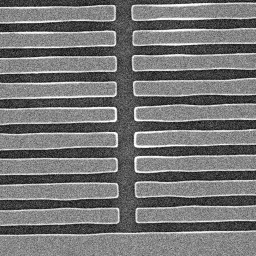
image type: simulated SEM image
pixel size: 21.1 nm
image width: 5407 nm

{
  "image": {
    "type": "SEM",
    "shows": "groups of lines, slits or small figures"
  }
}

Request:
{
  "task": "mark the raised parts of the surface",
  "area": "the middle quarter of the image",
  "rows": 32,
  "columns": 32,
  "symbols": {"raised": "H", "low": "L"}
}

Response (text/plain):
HHHHHHHHHHHHHLLLLHHHHHHHHHHHHHHH
HHHHHHHHHHHHHLLLLLHHHHHHHHHHHHLL
LLLLLLLLLLLLLLLLLLLLLLLLLLLLLLLL
LLLLLLLLLLLLLLLLLLLLLLLLLLLLLLLL
LLLLLLLLLLLLLLLLLLHHHHHHHHHHHHHH
HHHHHHHHHHHHHLLLLLHHHHHHHHHHHHHH
HHHHHHHHHHHHHLLLLLHHHHHHHHHHHHHH
HHHHHHHHHHHHHLLLLLHHHHHHHHHHHHHH
LLLLLLLLLLLLLLLLLLLLLLLLLLLLLLLL
LLLLLLLLLLLLLLLLLLLLLLLLLLLLLLLL
LLLLLLLLLLLLLLLLLLLLLLLLLHHHHHHH
HHHHHHHHHHHHHLLLLLHHHHHHHHHHHHHH
HHHHHHHHHHHHHLLLLLHHHHHHHHHHHHHH
HHHHHHHHHHHHHLLLLLHHHHHHHHHHHHHH
HHHLLLLLLLLLLLLLLLLLLLLLLLLLLLLL
LLLLLLLLLLLLLLLLLLLLLLLLLLLLLLLL
LLLLLLLLLLLLLLLLLLLLLLLLLLLLLLLL
HHHHHHHHHHHHHLLLLLHHHHHHHHHHHHHH
HHHHHHHHHHHHHLLLLLHHHHHHHHHHHHHH
HHHHHHHHHHHHHLLLLLHHHHHHHHHHHHHH
HHHHHHHHHHHHHLLLLLHHHHHHHLLLLLLL
LLLLLLLLLLLLLLLLLLLLLLLLLLLLLLLL
LLLLLLLLLLLLLLLLLLLLLLLLLLLLLLLL
LLLLLLLLLLLLLLLLLLHHHHHHHHHHHHHH
HHHHHHHHHHHHHLLLLLHHHHHHHHHHHHHH
HHHHHHHHHHHHHLLLLLHHHHHHHHHHHHHH
HHHHHHHHHHHHHLLLLLHHHHHHHHHHHHHH
LLLLLLLLLLLLLLLLLLLLLLLLLLLLLLLL
LLLLLLLLLLLLLLLLLLLLLLLLLLLLLLLL
LLLLLLLLLLLLLLLLLLLLLLLLLLLLLHHH
HHHHHHHHHHHHHLLLLLHHHHHHHHHHHHHH
HHHHHHHHHHHHHHLLLLHHHHHHHHHHHHHH